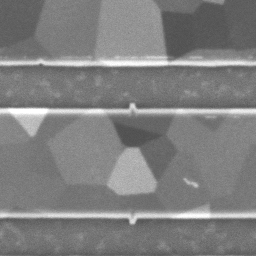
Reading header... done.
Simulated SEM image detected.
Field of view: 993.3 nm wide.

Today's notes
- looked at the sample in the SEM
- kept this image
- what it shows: one or a few lines or trenches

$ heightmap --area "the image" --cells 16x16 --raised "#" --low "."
################
################
################
################
................
................
................
################
################
################
################
################
################
........#..#....
................
................